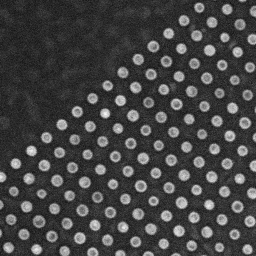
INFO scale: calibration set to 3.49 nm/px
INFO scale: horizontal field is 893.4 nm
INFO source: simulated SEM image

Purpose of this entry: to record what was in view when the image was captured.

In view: a regular array of raised bodies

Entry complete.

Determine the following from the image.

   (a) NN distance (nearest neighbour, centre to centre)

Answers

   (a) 0.0679 um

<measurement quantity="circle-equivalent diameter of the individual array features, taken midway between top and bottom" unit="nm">32.7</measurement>